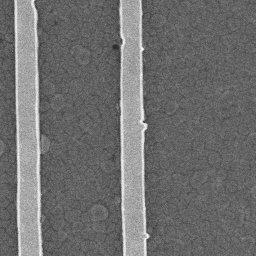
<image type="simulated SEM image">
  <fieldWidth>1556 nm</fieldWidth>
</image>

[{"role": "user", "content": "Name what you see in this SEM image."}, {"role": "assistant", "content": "one or a few lines or trenches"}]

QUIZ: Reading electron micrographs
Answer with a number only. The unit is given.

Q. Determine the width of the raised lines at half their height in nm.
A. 122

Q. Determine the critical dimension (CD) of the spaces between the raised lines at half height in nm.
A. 515